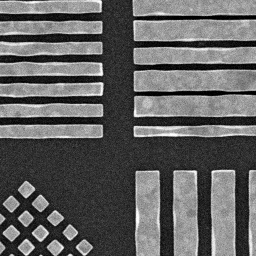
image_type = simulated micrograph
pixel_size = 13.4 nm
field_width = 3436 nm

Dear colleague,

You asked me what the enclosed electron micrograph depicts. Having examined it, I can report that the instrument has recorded groups of lines, slits or small figures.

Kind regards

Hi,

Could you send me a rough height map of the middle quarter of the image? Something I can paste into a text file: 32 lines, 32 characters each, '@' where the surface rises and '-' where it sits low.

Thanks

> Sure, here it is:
@@@@@@@@@-----------------------
@@@@@@@@@-----------------------
@@@@@@@@@---------@@@@@@@@@@@@@@
------------------@@@@@@@@@@@@@@
------------------@@@@@@@@@@@@@@
@@@@@@@@@@--------@@@@@@@@@@@@@@
@@@@@@@@@@--------@@@@@@@@@@@@@@
@@@@@@@@@-----------------------
------------------@@@@@@@@@@@@@@
------------------@@@@@@@@@@@@@@
@@@@@@@@@@--------@@@@@@@@@@@@@@
@@@@@@@@@@--------@@@@@@@@@@@@@@
@@@@@@@@@@--------@@@@@@@@@@@@@@
--------------------------------
--------------------------------
@@@@@@@@@-----------------------
@@@@@@@@@@--------@@@@@@@@@@@@@@
@@@@@@@@@@--------@@@@@@@@@@@@@@
--------------------------------
--------------------------------
--------------------------------
--------------------------------
--------------------------------
--------------------------------
--------------------------------
--------------------------------
--------------------------------
------------------@@@@@@----@@@@
------------------@@@@@@----@@@@
------------------@@@@@@----@@@@
------------------@@@@@@----@@@@
------------------@@@@@@----@@@@